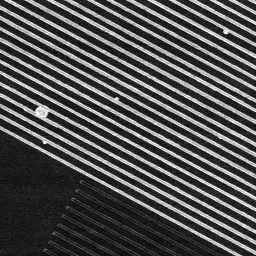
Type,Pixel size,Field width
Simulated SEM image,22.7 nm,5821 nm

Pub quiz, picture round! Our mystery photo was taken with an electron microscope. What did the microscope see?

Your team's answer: parallel lines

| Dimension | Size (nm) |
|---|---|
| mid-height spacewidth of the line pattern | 163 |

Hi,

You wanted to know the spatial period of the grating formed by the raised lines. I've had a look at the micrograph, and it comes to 219 nm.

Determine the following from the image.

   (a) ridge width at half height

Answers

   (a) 60.1 nanometres